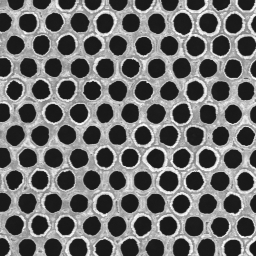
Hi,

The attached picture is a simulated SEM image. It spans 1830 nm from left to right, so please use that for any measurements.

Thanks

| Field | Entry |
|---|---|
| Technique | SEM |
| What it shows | a regular array of holes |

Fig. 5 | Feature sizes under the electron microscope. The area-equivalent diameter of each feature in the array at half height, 133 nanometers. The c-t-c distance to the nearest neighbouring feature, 181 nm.